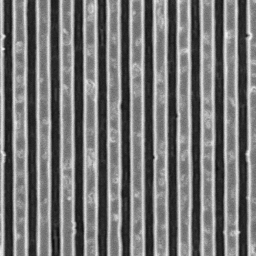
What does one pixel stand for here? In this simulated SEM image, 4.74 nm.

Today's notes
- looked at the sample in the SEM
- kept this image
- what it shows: parallel lines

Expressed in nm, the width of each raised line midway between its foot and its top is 64.6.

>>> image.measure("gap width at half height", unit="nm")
46.2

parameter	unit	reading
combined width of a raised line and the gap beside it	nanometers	111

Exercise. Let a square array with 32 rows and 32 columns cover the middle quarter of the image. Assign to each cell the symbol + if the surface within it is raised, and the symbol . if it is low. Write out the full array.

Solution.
++...+++...+++..++++..++++...+++
++...+++...+++...+++..++++...+++
++...+++...+++...+++..++++...++.
++...+++...+++...+++...+++..+++.
++...+++...+++...+++...+++..++++
++...+++...+++...+++...+++..+++.
++...+++...+++...+++..++++..+++.
++...+++...+++...+++..++++..+++.
++...+++...+++...+++..++++..+++.
++...+++...+++...+++..++++..+++.
++...+++...+++...+++..++++..+++.
++...+++...+++...+++..++++..+++.
++...+++...+++...+++..++++...+++
++...+++...+++...+++..++++...+++
++...+++...+++...+++..++++...+++
++...+++...+++...+++..++++...+++
++...+++...+++...+++...+++..++++
++...+++...+++...+++...+++..++++
++...+++...+++...+++...+++..++++
++...+++...+++...+++...+++..++++
++...+++...+++...+++...+++..+++.
++...+++...+++...+++...+++..+++.
++...+++...+++...+++...+++..++++
++...+++...+++...+++...+++..++++
++...+++...+++...+++...+++..++++
++...+++...+++...+++...+++..++++
++...+++...+++...+++...+++..++++
++...+++...+++...+++...+++..++++
++...+++...+++...+++...+++..++++
++...+++...+++...+++...+++..++++
++...+++...+++...+++...+++...+++
++...+++...+++...+++...+++...+++